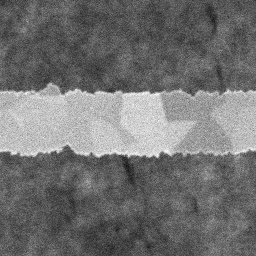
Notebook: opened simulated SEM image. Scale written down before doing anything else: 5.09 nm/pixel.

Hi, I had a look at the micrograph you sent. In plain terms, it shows one or a few lines or trenches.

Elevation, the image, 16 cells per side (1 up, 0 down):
0000000000000000
0000000000000000
0000000000000000
0000000000000000
0000000000000000
0001000000000000
1111111111111111
1111111111111111
1111111111111111
0110011111111110
0000000000000000
0000000000000000
0000000000000000
0000000000000000
0000000000000000
0000000000000000